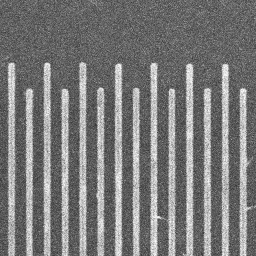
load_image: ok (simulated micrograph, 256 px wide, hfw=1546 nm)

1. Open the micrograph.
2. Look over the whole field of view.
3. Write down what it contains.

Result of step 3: parallel lines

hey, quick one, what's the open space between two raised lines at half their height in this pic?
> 0.0717 µm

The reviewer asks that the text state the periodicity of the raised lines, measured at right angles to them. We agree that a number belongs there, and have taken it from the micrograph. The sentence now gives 108 nm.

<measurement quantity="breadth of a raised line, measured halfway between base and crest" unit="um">0.0332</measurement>